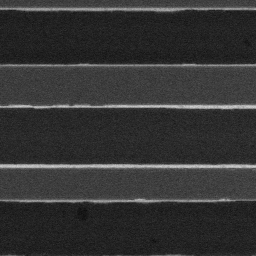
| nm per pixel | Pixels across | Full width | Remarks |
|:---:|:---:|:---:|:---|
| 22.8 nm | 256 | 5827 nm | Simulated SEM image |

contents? lines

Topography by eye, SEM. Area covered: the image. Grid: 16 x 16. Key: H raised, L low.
LLLLLLLLLLLLLLLL
LLLLLLLLLLLLLLLL
LLLLLLLLLLLLLLLL
LLLLLLLLLLLLLLLL
HHHHHHHHHHHHHHHH
HHHHHHHHHHHHHHHH
HHHHHHHHHHHHHHHH
LLLLLLLLLLLLLLLL
LLLLLLLLLLLLLLLL
LLLLLLLLLLLLLLLL
HHHHHHHHHHHHHHHH
HHHHHHHHHHHHHHHH
LLLLLLLLLLLLLLLL
LLLLLLLLLLLLLLLL
LLLLLLLLLLLLLLLL
LLLLLLLLLLLLLLLL